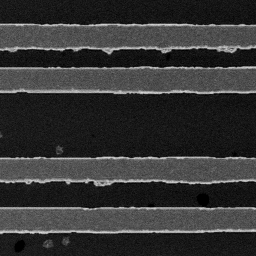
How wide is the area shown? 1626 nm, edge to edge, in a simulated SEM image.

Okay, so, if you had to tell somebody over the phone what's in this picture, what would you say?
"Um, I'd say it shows lines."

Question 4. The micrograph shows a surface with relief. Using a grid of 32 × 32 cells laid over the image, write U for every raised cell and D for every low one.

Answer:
DDDDDDDDDDDDDDDDDDDDDDDDDDDDDDDD
DDDDDDDDDDDDDDDDDDDDDDDDDDDDDDDD
DDDDDDDDDDDDDDDDDDDDDDDDDDDDDDDD
UUUUUUUUUUUUUUUUUUUUUUUUUUUUUUUU
UUUUUUUUUUUUUUUUUUUUUUUUUUUUUUUU
UUUUUUUUUUUUUUUUUUUUUUUUUUUUUUUU
DDDDDDDDDDDDDDDDDDDDDDDDDDDDDDDD
DDDDDDDDDDDDDDDDDDDDDDDDDDDDDDDD
DDDDDDDUDUDDDUDDUUUUUUUUUUDUUUUU
UUUUUUUUUUUUUUUUUUUUUUUUUUUUUUUU
UUUUUUUUUUUUUUUUUUUUUUUUUUUUUUUU
UUDUUDDDDDUUUUUUUUUUUUUUUUUUUUUU
DDDDDDDDDDDDDDDDDDDDDDDDDDDDDDDD
DDDDDDDDDDDDDDDDDDDDDDDDDDDDDDDD
DDDDDDDDDDDDDDDDDDDDDDDDDDDDDDDD
DDDDDDDDDDDDDDDDDDDDDDDDDDDDDDDD
DDDDDDDDDDDDDDDDDDDDDDDDDDDDDDDD
DDDDDDDDDDDDDDDDDDDDDDDDDDDDDDDD
DDDDDDDDDDDDDDDDDDDDDDDDDDDDDDDD
DDDDDDDDDDDDDDDDDDDDDDDDDDDDDDDD
UUUUUUUUUUUUUUUUUUUUUUUUUUUUUUUU
UUUUUUUUUUUUUUUUUUUUUUUUUUUUUUUU
UUUUUUUUUUUUUUUUUUUUUUUUUUUUUUUU
DDDDDDDDDDDDDDDDDDDDDDDDDDDDDDDD
DDDDDDDDDDDDDDDDDDDDDDDDDDDDDDDD
DDDDDDDDDDDDDDDDDDDDDDDDDDDDDDDD
UUUUUUUUUUUUUUUUUUUUUUUUUUUUUUUU
UUUUUUUUUUUUUUUUUUUUUUUUUUUUUUUU
UUUUUUUUUUUUUUUUUUUUUUUUUUUUUUUU
DDDDDDDDDDDDDDDDDDDDDDDDDDDDDDDD
DDDDDDDDDDDDDDDDDDDDDDDDDDDDDDDD
DDDDDDDDDDDDDDDDDDDDDDDDDDDDDDDD